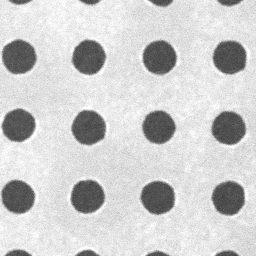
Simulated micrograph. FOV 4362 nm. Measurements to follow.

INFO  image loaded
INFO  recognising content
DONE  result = a regular array of holes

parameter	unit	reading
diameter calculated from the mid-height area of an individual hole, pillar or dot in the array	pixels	36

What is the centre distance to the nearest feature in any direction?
1.19 µm